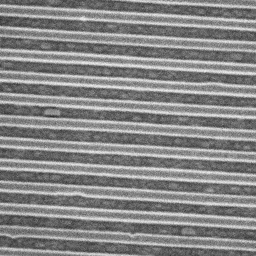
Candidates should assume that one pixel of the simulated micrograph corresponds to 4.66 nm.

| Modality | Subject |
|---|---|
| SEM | parallel lines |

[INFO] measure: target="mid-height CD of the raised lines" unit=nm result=46.5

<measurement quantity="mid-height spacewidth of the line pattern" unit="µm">0.0558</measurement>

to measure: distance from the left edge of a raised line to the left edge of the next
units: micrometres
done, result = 0.103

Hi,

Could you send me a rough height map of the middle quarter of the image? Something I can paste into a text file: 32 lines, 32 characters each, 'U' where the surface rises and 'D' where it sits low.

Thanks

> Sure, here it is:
DDDDDDDDDDDDDDDDUUUUUUUUUUUUUUUU
DDDDDDDDDDDDDDDDDDDDDDDDDDDDDDDD
DDDDDDDDDDDDDDDDDDDDDDDDDDDDDDDD
UUUUUUUUUUDDDDDDDDDDDDDDDDDDDDDD
UUUUUUUUUUUUUUUUUUUUUUUUUUDDDDDD
DDDDDDDDUUUUUUUUUUUUUUUUUUUUUUUU
DDDDDDDDDDDDDDDDDDDDDUUUUUUUUUUU
DDDDDDDDDDDDDDDDDDDDDDDDDDDDDDDD
UDDDDDDDDDDDDDDDDDDDDDDDDDDDDDDD
UUUUUUUUUUUUUUUUUUDDDDDDDDDDDDDD
UUUUUUUUUUUUUUUUUUUUUUUUUUUUUUUU
DDDDDDDDDDDDDUUUUUUUUUUUUUUUUUUU
DDDDDDDDDDDDDDDDDDDDDDDDDDDDDUUU
DDDDDDDDDDDDDDDDDDDDDDDDDDDDDDDD
UUUUUUUUUUUUUDDDDDDDDDDDDDDDDDDD
UUUUUUUUUUUUUUUUUUUUUUUUUUDDDDDD
DDDDDDDDUUUUUUUUUUUUUUUUUUUUUUUU
DDDDDDDDDDDDDDDDDDDDDDDDDUUUUUUU
DDDDDDDDDDDDDDDDDDDDDDDDDDDDDDDD
UUDDDDDDDDDDDDDDDDDDDDDDDDDDDDDD
UUUUUUUUUUUUUUUUUUDDDDDDDDDDDDDD
UUUUUUUUUUUUUUUUUUUUUUUUUUUUUUUU
DDDDDDDDDDDDDDDDDUUUUUUUUUUUUUUU
DDDDDDDDDDDDDDDDDDDDDDDDDDDDDDDD
DDDDDDDDDDDDDDDDDDDDDDDDDDDDDDDD
UUUUUUUUUUDDDDDDDDDDDDDDDDDDDDDD
UUUUUUUUUUUUUUUUUUUUUUUUUUUUUUDD
DDDDDDUUUUUUUUUUUUUUUUUUUUUUUUUU
DDDDDDDDDDDDDDDDDDDDDUUUUUUUUUUU
DDDDDDDDDDDDDDDDDDDDDDDDDDDDDDDD
UUDDDDDDDDDDDDDDDDDDDDDDDDDDDDDD
UUUUUUUUUUUUUUUUUUDDDDDDDDDDDDDD